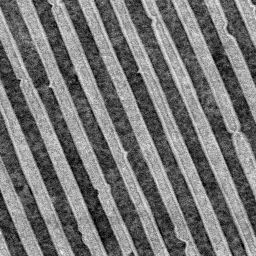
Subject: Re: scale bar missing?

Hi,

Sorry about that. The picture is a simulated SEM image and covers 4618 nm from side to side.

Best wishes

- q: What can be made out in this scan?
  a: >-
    parallel lines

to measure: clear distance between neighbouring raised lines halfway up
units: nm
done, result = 305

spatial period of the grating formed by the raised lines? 0.524 micrometres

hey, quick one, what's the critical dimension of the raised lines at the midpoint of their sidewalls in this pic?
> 222 nm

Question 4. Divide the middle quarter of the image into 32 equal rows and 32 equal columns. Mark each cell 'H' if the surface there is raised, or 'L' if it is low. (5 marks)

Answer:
LLLHHHLLLLLHHHLLLLLHHHLLLLHHHHLL
LLLHHHLLLLLHHHLLLLLHHHLLLLLHHHLL
LLLHHHHLLLLLHHHLLLLHHHLLLLLHHHHL
LLLLHHHLLLLLHHHLLLLLHHHLLLLLHHHL
LLLLHHHHLLLLHHHHLLLLLHHLLLLLHHHH
LLLLLHHHLLLLLHHHLLLLLHHHLLLLLHHH
HLLLLHHHLLLLLHHHHLLLLHHHLLLLLHHH
HLLLLHHHHLLLLLHHHLLLLLHHLLLLLHHH
HLLLLLHHHLLLLLHHHHLLLLHHHLLLLLHH
HHLLLLHHHHLLLLHHHHLLLLLHHLLLLLHH
HHLLLLLHHHLLLLLHHHLLLLLHHHLLLLLH
HHHLLLLHHHLLLLLHHHHLLLLHHHLLLLLH
HHHLLLLLHHHLLLLLHHHLLLLLHHHLLLLH
HHHHLLLLHHHLLLLLHHHLLLLLHHHLLLLL
LHHHLLLLLHHHLLLLLHHHLLLLLHHLLLLL
LHHHLLLLLHHHLLLLLHHHLLLLLHHHLLLL
LLHHHLLLLHHHHLLLLHHHHLLLLHHHLLLL
LLHHHLLLLLHHHLLLLLHHHLLLLLHHHLLL
LLHHHHLLLLHHHLLLLLHHHHLLLLHHHLLL
LLLHHHLLLLLHHHLLLLLHHHLLLLLHHHLL
LLLHHHLLLLLHHHLLLLLHHHLLLLLHHHLL
LLLLHHHLLLLLHHHLLLLLHHHLLLLHHHHL
LLLLHHHLLLLLHHHHLLLLHHHLLLLLHHHL
LLLLHHHHLLLLHHHLLLLLHHHHLLLLHHHH
HLLLLHHHLLLLLHHHLLLLLHHHLLLLLHHH
HLLLLHHHHLLLLHHHLLLLLHHHHLLLLHHH
HHLLLLHHHLLLLLHHHLLLLLHHHLLLLLHH
HHLLLLHHHLLLLLHHHLLLLLHHHLLLLLHH
HHLLLLLHHHLLLLLHHHLLLLHHHHLLLLHH
HHHLLLLHHHLLLLLHHHLLLLLHHHLLLLLH
HHHLLLLHHHHLLLLLHHLLLLLHHHHLLLLH
HHHHLLLLHHHLLLLLHHHLLLLLHHHLLLLL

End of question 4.